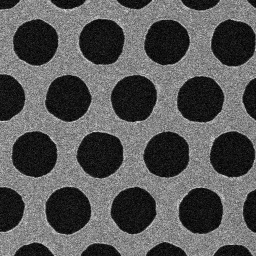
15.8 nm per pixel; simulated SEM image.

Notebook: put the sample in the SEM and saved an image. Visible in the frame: a regular array of holes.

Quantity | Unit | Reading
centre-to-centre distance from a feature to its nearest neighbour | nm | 1020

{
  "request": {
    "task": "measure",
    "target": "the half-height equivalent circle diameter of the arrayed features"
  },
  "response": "730 nm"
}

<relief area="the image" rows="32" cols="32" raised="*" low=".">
..*****...*****....****....****.
********************************
****.*******..******.*******.***
**.....***.....****....****....*
**.....***......**......***.....
**.....***......**......**......
**.....***.....***.....****.....
***...*****....****...*****....*
********************************
.*******.*******..**************
..****.....****....****....****.
...***.....***......**......**..
...***.....***......**......**..
...***.....***.....***......***.
..*****...*****....****....****.
********************************
****.*******.****************.**
**....****.....****....****....*
**.....***.....***......**......
*......***.....***......**......
**.....***.....***......**......
***...*****...*****....****....*
********************************
.*******..******..**************
...***.....****....****....****.
...***.....***.....***......***.
...***.....***......**......**..
...***.....***.....****.....***.
..*****...*****...*****....****.
********************************
****.******..*******.***********
**....****.....***.....****....*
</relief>